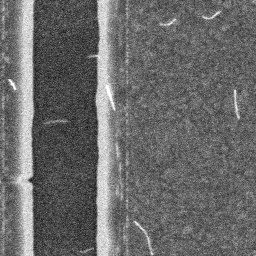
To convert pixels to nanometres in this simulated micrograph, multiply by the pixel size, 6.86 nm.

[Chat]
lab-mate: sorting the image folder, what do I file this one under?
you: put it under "one or a few lines or trenches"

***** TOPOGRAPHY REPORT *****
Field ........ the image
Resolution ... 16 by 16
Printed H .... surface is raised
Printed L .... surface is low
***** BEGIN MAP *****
HHLLLLHHHHHHHHHH
HHLLLLHHHHHHHHHH
HHLLLLHHHHHHHHHH
HHLLLLHHHHHHHHHH
HHLLLLHHHHHHHHHH
HHLLLLHHHHHHHHHH
HHLLLLHHHHHHHHHH
HHLLLLHHHHHHHHHH
HHLLLLHHHHHHHHHH
HHLLLLHHHHHHHHHH
HHLLLLHHHHHHHHHH
HHLLLLHHHHHHHHHH
HHLLLLHHHHHHHHHH
HHLLLLHHHHHHHHHH
HHLLLLHHHHHHHHHH
HHLLLLHHHHHHHHHH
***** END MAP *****